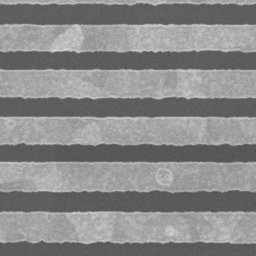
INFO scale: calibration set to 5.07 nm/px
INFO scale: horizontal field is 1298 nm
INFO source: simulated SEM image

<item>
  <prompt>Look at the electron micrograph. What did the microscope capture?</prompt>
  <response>lines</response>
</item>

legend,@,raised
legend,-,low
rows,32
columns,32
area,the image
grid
----------------@--@----------@-
--------------------------------
--------------------------------
@@@@@@@@@@@@@@@@@@@@@@@@@@@@@@@@
@@@@@@@@@@@@@@@@@@@@@@@@@@@@@@@@
@@@@@@@@@@@@@@@@@@@@@@@@@@@@@@@@
--------------------------------
--------------------------------
--------------------------------
@@@@@@@@@@@@@@@@@@@@@@@@@@@@@@@@
@@@@@@@@@@@@@@@@@@@@@@@@@@@@@@@@
@@@@@@@@@@@@@@@@@@@@@@@@@@@@@@@@
--------------------------------
--------------------------------
--------------------------------
@@@@@@@@@@@@@@@@@@@@@@@@@@@@@@@@
@@@@@@@@@@@@@@@@@@@@@@@@@@@@@@@@
@@@@@@@@@@@@@@@@@@@@@@@@@@@@@@@@
--------------------------------
--------------------------------
@@@@@@@@@@@@@@@@@@@@@@@@@@@@@@@@
@@@@@@@@@@@@@@@@@@@@@@@@@@@@@@@@
@@@@@@@@@@@@@@@@@@@@@@@@@@@@@@@@
@@@@@@@@@@@@@@@@@@@@@@@@@@@@@@@@
--------------------------------
--------------------------------
--------------------------------
@@@@@@@@@@@@@@@@@@@@@@@@@@@@@@@@
@@@@@@@@@@@@@@@@@@@@@@@@@@@@@@@@
@@@@@@@@@@@@@@@@@@@@@@@@@@@@@@@@
--------------------------------
--------------------------------